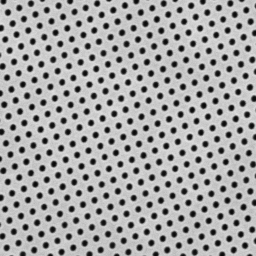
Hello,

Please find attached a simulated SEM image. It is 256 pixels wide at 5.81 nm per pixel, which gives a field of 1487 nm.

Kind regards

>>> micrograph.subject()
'a regular array of holes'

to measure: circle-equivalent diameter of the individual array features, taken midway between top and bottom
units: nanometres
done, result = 37.1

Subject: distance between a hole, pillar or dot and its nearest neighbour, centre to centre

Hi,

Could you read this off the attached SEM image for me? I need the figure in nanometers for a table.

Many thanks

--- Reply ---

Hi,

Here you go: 69.7